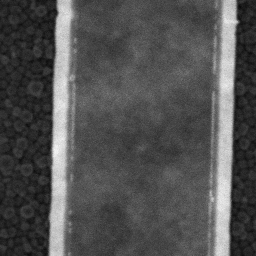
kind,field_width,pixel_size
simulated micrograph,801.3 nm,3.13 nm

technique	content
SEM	one or a few lines or trenches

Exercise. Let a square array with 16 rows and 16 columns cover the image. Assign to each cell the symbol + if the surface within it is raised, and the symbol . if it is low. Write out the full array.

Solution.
....++++++++++..
....++++++++++..
....++++++++++..
....++++++++++..
....++++++++++..
....++++++++++..
....++++++++++..
....++++++++++..
....++++++++++..
....++++++++++..
....++++++++++..
....++++++++++..
....++++++++++..
....++++++++++..
....++++++++++..
...+++++++++++..